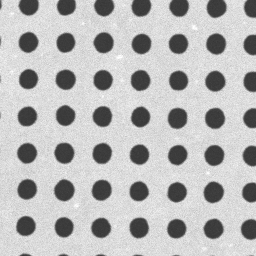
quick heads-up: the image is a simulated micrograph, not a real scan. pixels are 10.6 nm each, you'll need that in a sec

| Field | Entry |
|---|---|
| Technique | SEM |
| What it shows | a regular array of holes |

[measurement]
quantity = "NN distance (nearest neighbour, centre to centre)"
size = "390 nanometers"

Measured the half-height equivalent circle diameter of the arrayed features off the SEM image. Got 212 nm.